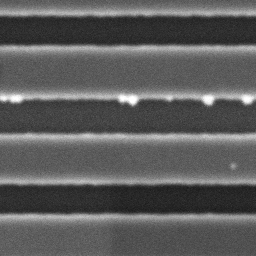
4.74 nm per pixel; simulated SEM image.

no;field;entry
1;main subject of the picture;lines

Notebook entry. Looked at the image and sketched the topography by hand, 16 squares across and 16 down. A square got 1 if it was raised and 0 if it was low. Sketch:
1111111111111111
0000000000000000
0000000000000000
1111111111111111
1111111111111111
1111111111111111
0000000000000000
0000000000000000
1111111111111111
1111111111111111
1111111111111111
0000000000000000
0000000000000000
1111111111111111
1111111111111111
1111111111111111